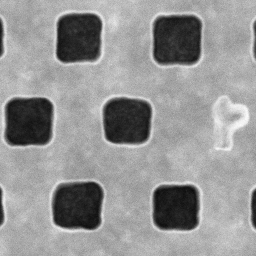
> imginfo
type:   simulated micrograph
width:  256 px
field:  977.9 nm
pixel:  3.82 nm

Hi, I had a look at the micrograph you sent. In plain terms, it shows holes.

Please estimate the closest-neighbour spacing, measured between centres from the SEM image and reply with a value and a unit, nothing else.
369 nm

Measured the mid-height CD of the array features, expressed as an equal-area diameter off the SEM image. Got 197 nm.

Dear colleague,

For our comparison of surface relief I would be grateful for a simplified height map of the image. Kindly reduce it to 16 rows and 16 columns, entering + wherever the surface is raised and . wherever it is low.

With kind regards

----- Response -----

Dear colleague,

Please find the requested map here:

++++++++++++++++
++++..++++...+++
++++..++++...+++
++++..++++..++++
++++++++++++++++
++++++++++++++++
+..++++..+++++++
...+++...+++++++
...++++..+++++++
++++++++++++++++
++++++++++++++++
++++..++++++++++
+++...++++..++++
+++...++++..++++
++++++++++++++++
++++++++++++++++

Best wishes